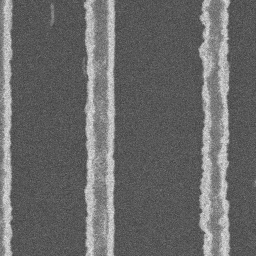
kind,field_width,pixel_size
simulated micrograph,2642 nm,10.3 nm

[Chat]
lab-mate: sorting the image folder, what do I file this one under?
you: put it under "one or a few lines or trenches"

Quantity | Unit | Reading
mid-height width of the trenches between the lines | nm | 918